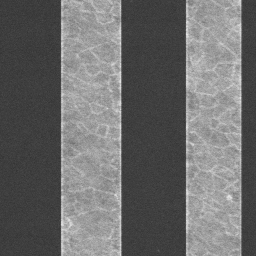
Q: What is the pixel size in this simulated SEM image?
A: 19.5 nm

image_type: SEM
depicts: wiring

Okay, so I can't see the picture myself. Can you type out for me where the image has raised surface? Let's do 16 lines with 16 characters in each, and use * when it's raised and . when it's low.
....****....***.
....****....***.
....****....***.
....****....***.
....****....***.
....****....***.
....****....***.
....****....***.
....****....***.
....****....***.
....****....***.
....****....***.
....****....***.
....****....***.
....****....***.
....****....***.